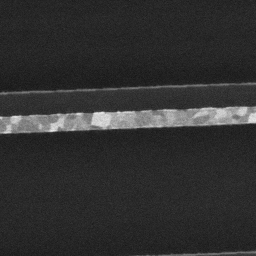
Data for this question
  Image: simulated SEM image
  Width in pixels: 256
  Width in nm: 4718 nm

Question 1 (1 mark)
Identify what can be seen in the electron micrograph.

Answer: lines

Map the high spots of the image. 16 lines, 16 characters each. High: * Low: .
................
................
................
................
................
........********
****************
****************
................
................
................
................
................
................
................
................